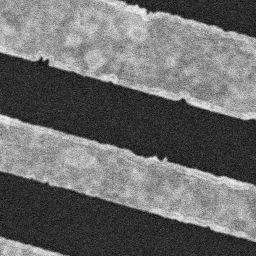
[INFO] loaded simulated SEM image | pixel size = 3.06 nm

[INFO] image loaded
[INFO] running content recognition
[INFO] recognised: one or a few lines or trenches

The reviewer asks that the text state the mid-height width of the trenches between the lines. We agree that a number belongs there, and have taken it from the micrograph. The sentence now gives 193 nanometres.